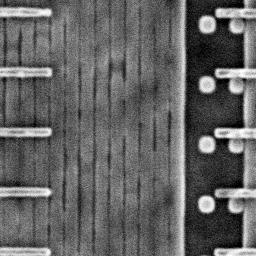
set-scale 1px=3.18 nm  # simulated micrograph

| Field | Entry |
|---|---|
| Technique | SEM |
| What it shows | wiring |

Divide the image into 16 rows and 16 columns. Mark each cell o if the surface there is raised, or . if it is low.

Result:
oooooooooooo...o
oooooooooooo..oo
oooooooooooo...o
oooooooooooo...o
oooooooooooo..oo
oooooooooooo...o
oooooooooooo...o
ooooooooooo....o
ooooooooooo...oo
ooooooooooo....o
ooooooooooo....o
oooooooooooo...o
oooooooooooo..oo
ooooooooooo....o
ooooooooooo....o
ooooooooooo....o